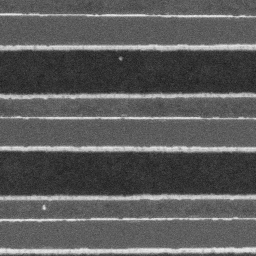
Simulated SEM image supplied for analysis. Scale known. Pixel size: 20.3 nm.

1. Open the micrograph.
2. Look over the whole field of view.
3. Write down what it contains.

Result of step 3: lines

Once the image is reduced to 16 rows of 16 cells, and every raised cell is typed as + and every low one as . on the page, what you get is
++++++++++++++++
++++++++++++++++
++++++++++++++++
................
................
................
++++++++++++++++
++++++++++++++++
++++++++++++++++
................
................
................
++++++++++++++++
++++++++++++++++
++++++++++++++++
++++++++++++++++